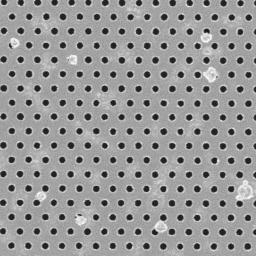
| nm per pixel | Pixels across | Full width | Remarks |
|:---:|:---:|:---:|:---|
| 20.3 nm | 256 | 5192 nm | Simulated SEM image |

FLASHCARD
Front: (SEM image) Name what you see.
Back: a regular array of holes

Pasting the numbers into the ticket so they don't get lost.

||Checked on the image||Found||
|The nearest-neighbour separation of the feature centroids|333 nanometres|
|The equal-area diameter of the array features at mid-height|133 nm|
